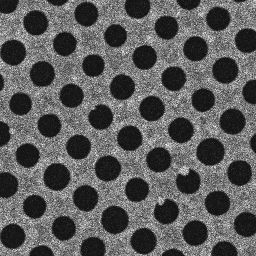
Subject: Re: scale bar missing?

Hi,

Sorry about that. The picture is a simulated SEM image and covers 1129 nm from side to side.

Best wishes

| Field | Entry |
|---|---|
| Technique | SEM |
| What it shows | a regular array of holes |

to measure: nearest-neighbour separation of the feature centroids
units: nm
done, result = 159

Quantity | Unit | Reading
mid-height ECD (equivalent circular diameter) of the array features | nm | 110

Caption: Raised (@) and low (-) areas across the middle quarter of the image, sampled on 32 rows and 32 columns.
@@@@------@@@@@@@@----@@@@@@@@@@
@@@@@-----@@@@@@@@@@@@@@@-----@@
@@@@@@---@@@@@@@@@@@@@@@@-----@@
@@@@@@@@@@@@-----@@@@@@@-------@
@@@@@@@@@@@@-----@@@@@@@-------@
----@@@@@@@-------@@@@@@@-----@@
-----@@@@@@-------@@@@@@@@---@@@
-----@@@@@@@-----@@@@@@@@@@@@@@@
-----@@@@@@@@---@@@@----@@@@@@@@
-----@@@@@@@@@@@@@@------@@@@@@@
----@@@@---@@@@@@@@------@@@@@@@
@@@@@@@-----@@@@@@@------@@@@@@@
@@@@@@------@@@@@@@------@@@@@@@
@@@@@@------@@@@@@@@----@@@@--@@
@@@@@@------@@@@@@@@@@@@@@@-----
@@@@@@@----@@@@@-@@@@@@@@@------
@@@@@@@@@-@@@@-----@@@@@@@------
@@@@@@@@@@@@@------@@@@@@@------
@-----@@@@@@@-------@@@@@@@-----
@------@@@@@@------@@@@@@@@@---@
@------@@@@@@@-----@@@@@@@@@@@@@
@------@@@@@@@@---@@@@----@@@@@@
@-----@@@@@@@@@@@@@@@------@@@@@
@@---@@@@----@@@@@@@@------@@@@@
@@@@@@@@------@@@@@@-------@@@@@
@@@@@@@@------@@@@@@@------@@@@@
-@@@@@@@------@@@@@@@@----@@@@@-
-@@@@@@@------@@@@@@@@@@@@@@@@@-
--@@@@@@@----@@@@-@@@@@@@@@@----
-@@@@@@@@@@@@@@@----@@@@@@@@----
-@@@---@@@@@@@@------@@@@@@@----
@@@-----@@@@@@@------@@@@@@@@---